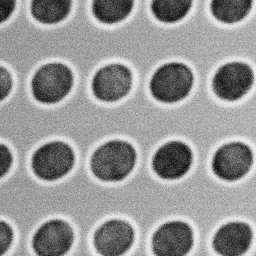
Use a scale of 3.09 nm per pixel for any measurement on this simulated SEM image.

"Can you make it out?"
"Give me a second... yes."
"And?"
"a regular array of holes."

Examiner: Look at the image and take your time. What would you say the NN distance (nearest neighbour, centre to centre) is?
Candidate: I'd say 184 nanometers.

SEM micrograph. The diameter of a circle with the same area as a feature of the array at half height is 0.133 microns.